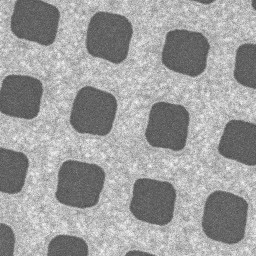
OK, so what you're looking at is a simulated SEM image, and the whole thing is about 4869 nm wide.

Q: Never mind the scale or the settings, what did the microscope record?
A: holes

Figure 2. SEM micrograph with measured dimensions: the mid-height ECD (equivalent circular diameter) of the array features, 930 nm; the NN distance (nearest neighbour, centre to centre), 1.4 micrometres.